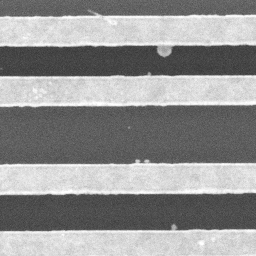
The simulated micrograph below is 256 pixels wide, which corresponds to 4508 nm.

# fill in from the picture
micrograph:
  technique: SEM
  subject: lines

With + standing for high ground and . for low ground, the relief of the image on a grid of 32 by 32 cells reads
................................
................................
++++++++++++++++++++++++++++++++
++++++++++++++++++++++++++++++++
++++++++++++++++++++++++++++++++
++++++++++++++++++++++++++++++.+
................................
................................
................................
................................
++++++++++++++++++++++++++++++++
++++++++++++++++++++++++++++++++
++++++++++++++++++++++++++++++++
................................
................................
................................
................................
................................
................................
................................
................................
++++++++++++++++++++++++++++++++
++++++++++++++++++++++++++++++++
++++++++++++++++++++++++++++++++
................................
................................
................................
................................
................................
++++++++++++++++++++++++++++++++
++++++++++++++++++++++++++++++++
++++++++++++++++++++++++++++++++